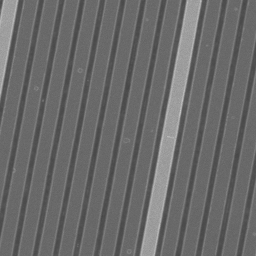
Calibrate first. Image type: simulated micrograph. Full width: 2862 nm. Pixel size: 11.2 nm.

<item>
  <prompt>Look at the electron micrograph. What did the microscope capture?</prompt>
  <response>parallel lines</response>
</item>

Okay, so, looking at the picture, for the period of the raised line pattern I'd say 224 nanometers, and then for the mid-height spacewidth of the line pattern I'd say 67.3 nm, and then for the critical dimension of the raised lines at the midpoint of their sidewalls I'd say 164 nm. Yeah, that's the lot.